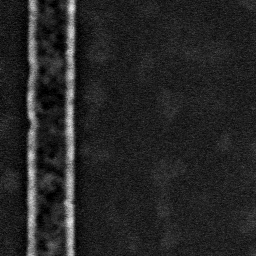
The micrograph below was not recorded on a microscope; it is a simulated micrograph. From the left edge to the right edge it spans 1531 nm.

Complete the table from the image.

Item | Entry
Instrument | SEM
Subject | one or a few lines or trenches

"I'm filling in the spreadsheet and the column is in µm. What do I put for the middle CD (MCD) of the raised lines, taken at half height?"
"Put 0.235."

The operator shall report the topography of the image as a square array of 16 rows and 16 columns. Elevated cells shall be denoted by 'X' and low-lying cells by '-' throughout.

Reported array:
--XX------------
--XX------------
--XX------------
--XX------------
--XX------------
--XX------------
--XX------------
--XX------------
--XX------------
--XX------------
--XX------------
--XX------------
--XX------------
--XX------------
--XX------------
--XX------------